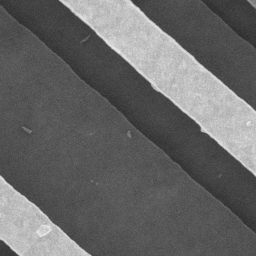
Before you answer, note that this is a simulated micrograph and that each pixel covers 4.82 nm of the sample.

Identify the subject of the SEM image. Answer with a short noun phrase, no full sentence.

lines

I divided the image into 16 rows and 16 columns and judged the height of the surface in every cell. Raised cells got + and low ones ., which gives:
....+++++.......
.....+++++......
......+++++.....
........++++....
.........++++...
..........++++..
...........++++.
............++++
.............+++
..............++
...............+
+...............
++..............
+++.............
++++............
.++++...........